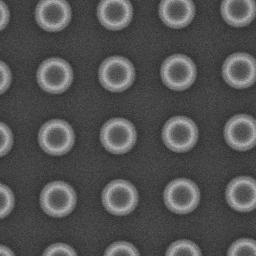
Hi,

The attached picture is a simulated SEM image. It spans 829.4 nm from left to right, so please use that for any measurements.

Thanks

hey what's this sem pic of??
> an array of small figures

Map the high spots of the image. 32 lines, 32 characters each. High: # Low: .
#....####...####....####....####
#...#####...#####...####....####
#...#####...####....####....####
#....###.....##.................
................................
................................
................................
......##.....###.....###....####
#....####...#####...####....####
#....####...#####...####....####
#....####....###.....###.....###
......##........................
................................
................................
.............................##.
#.....###....###.....###....####
#....####....####...#####...####
##...####....####...#####...####
#....####....###.....###.....##.
................................
................................
................................
..............#.......##.....###
#....####....####....####...####
##...#####...####...#####...####
##...####....####....####....###
#.....###.....##......##........
................................
................................
................................
.......#......##......##.....###
##....###....####....####...####